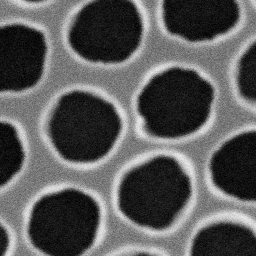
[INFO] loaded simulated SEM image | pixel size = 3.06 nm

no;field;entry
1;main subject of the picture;holes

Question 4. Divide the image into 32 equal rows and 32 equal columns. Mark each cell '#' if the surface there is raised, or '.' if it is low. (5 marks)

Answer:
###########......###..........##
##########........##..........##
#########.........##..........##
....####..........###........###
......##..........####.....#####
......###.........#############.
......###........#############..
......#####.....##############..
.....################..######...
.....##############......####...
.....#############........###...
########....######.........###..
#######......####..........###..
######........###.........######
######.........###........######
.####..........###.......#######
..###..........###......#######.
..####.........##############...
...####.......#############.....
...####......#######.#####......
...#######.######.....####......
..#############........###......
.##############.........###.....
###############.........###.....
#####......####.........#####...
####........###.........########
####.........##........#########
####........####......##########
.##.........######...####......#
.##.........############........
.###........############........
.####......#####...#####........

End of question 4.